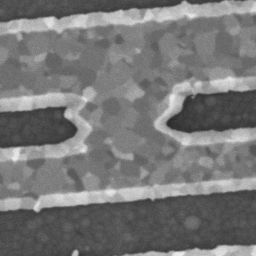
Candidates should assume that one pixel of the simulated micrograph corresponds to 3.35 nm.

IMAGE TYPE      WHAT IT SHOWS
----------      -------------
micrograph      one or a few lines or trenches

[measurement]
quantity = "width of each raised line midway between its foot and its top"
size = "226 nanometres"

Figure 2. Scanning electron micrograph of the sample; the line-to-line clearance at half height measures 169 nm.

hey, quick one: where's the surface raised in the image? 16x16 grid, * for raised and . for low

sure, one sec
..............**
....************
****************
****************
****************
*************...
*....******.....
.....*****......
.....******...**
...*************
****************
****************
****............
................
................
................